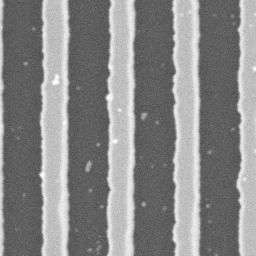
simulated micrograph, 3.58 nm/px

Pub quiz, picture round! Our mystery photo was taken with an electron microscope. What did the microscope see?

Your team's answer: lines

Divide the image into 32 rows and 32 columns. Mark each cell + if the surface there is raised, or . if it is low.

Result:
.....+++......+++.....+++.....++
.....+++......+++.....+++.....++
.....+++......+++.....+++.....++
.....++++.....+++.....+++.....++
.....++++.....+++.....+++.....++
.....+++......+++.....+++.....++
.....+++......+++.....+++.....++
.....+++......+++.....+++.....++
.....+++......+++.....+++.....++
......++......+++.....+++.....++
.....+++.....++++.....+++.....++
.....+++......+++.....+++.....++
.....+++.....++++.....+++.....++
.....+++.....++++.....+++.....++
.....+++......+++.....+++.....++
.....+++......+++.....+++.....++
.....+++......+++.....+++.....++
.....+++......+++.....+++.....++
.....+++......+++.....+++.....++
.....+++......+++.....+++.....++
.....+++......+++.....+++.....++
.....+++......+++.....+++.....++
.....+++.....++++.....+++.....++
.....+++......+++.....+++.....++
.....+++......+++.....+++.....++
.....+++.....++++.....+++.....++
.....+++.....++++.....+++.....++
.....+++.....++++.....+++.....++
.....+++.....++++.....+++.....++
.....+++.....+++......+++.....++
.....+++......++......+++.....++
.....+++......+++.....+++.....++